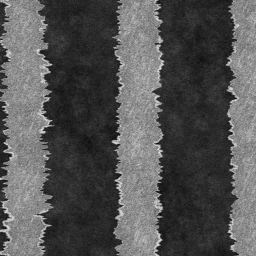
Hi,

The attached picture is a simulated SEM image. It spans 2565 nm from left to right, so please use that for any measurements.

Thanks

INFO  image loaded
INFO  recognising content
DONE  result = one or a few lines or trenches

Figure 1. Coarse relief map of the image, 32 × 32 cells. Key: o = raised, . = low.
.oooo..........ooooo.........ooo
.oooo..........ooooo.........ooo
.oooo..........ooooo.........ooo
.ooooo.........ooooo.........ooo
ooooo..........ooooo.........ooo
oooooo.........ooooo.........ooo
.oooo.........oooooo.........ooo
.ooooo.........ooooo.........ooo
oooooo.........ooooo.........ooo
.ooooo.........ooooo.........ooo
.ooooo.........ooooo.........ooo
oooooo.........oooo..........ooo
oooooo.........ooooo.........ooo
.oooo..........ooooo.........ooo
.ooooo.........ooooo.........ooo
.ooooo.........ooooo.........ooo
.oooo..........ooooo.........ooo
.oooo.........oooooo.........ooo
.ooooo.........ooooo.........ooo
.ooooo.........ooooo.........ooo
.ooooo.........ooooo.........ooo
.ooooo.........ooooo.........ooo
.ooooo.........ooooo.........ooo
.oooo..........ooooo.........ooo
.ooooo.........ooooo.........ooo
oooooo.........ooooo.........ooo
.ooooo.........ooooo.........ooo
.oooo..........ooooo.........ooo
oooooo.........ooooo.........ooo
.oooo..........ooooo.........ooo
.oooo..........ooooo.........ooo
ooooo..........ooooo.........ooo